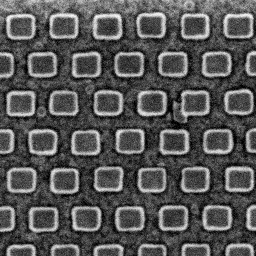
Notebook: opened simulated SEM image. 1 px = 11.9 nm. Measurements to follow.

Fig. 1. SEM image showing a regular array of raised bodies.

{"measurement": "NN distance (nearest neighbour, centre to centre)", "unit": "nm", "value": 515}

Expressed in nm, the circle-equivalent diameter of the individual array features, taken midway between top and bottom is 330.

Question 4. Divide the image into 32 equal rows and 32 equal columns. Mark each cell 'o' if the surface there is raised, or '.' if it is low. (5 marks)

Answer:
................................
................................
.ooo..oooo..ooo..oooo..ooo..oooo
.ooo..oooo..ooo..ooo...ooo..oooo
.ooo..ooo...ooo...oo...ooo..ooo.
................................
................................
oo..ooo..ooo..oooo..ooo..oooo..o
oo..ooo..ooo...ooo..ooo..oooo..o
.........ooo..............o.....
................................
.......oo...oo.....o....oo...oo.
.ooo..oooo..ooo..oooo..ooo..oooo
.ooo..oooo..ooo..oooo..ooo..oooo
................................
................................
o...ooo...oo...ooo..ooo...ooo..o
oo..ooo..ooo...ooo..ooo...ooo..o
oo..ooo..ooo...ooo..ooo...ooo..o
................................
................................
.ooo...ooo..ooo..oooo..ooo..oooo
.ooo..oooo..ooo..oooo..ooo..oooo
.ooo..oooo..ooo..oooo..ooo..ooo.
................................
................................
oo..ooo..oooo..ooo..ooo...ooo..o
oo..ooo..oooo..ooo..ooo..oooo..o
o...ooo..ooo...ooo..ooo...oo...o
................................
................................
.ooo..oooo..ooo..oooo..ooo..oooo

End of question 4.